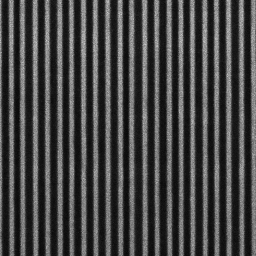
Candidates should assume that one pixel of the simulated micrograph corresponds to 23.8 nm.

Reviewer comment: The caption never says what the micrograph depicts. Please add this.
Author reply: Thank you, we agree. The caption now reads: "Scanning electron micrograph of parallel lines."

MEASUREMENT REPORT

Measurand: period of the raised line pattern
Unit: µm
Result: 0.288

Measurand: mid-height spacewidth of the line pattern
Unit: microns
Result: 0.176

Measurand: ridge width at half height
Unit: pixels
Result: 4.63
